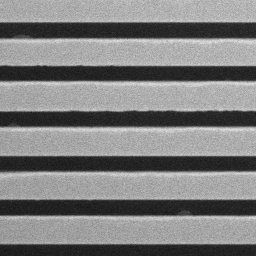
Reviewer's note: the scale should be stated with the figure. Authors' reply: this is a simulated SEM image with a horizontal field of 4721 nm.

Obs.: lines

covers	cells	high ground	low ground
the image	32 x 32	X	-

XXXXXXXXXXXXXXXXXXXXXXXXXXXXXXXX
XXXXXXXXXXXXXXXXXXXXXXXXXXXXXXXX
XXXXXXXXXXXXXXXXXXXXXXXXXXXXXXXX
--------------------------------
--------------------------------
XXXXXXXXXXXXXXXXXXXXXXXXXXXXXXXX
XXXXXXXXXXXXXXXXXXXXXXXXXXXXXXXX
XXXXXXXXXXXXXXXXXXXXXXXXXXXXXXXX
--------------------------------
--------------------------------
XXXXXXXXXXXXXXXXXXXXXXXXXXXXXXXX
XXXXXXXXXXXXXXXXXXXXXXXXXXXXXXXX
XXXXXXXXXXXXXXXXXXXXXXXXXXXXXXXX
XXXXXXXXXXXXXXXXXXXXXXXXXXXXXXXX
--------------------------------
--------------------------------
XXXXXXXXXXXXXXXXXXXXXXXXXXXXXXXX
XXXXXXXXXXXXXXXXXXXXXXXXXXXXXXXX
XXXXXXXXXXXXXXXXXXXXXXXXXXXXXXXX
------X-------------------------
--------------------------------
---XXXXXXXXXXXXX-XXXX-XXXXXXXXXX
XXXXXXXXXXXXXXXXXXXXXXXXXXXXXXXX
XXXXXXXXXXXXXXXXXXXXXXXXXXXXXXXX
XXXXXXXXXXXXXXXXXXXXXXXXXXXXXXXX
--------------------------------
--------------------------------
XXXXXXXXXXXXXXXXXXXXXXXXXXXXXXXX
XXXXXXXXXXXXXXXXXXXXXXXXXXXXXXXX
XXXXXXXXXXXXXXXXXXXXXXXXXXXXXXXX
--------------------------------
--------------------------------